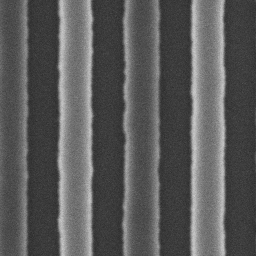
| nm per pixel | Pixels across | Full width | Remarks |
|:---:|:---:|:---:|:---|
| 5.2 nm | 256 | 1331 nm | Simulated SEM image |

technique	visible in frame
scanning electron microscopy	lines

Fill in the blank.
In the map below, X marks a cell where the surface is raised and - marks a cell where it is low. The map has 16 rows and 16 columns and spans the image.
XX--XX--XX--XX--
XX--XX--XX--XX--
XX--XX--XX--XX--
XX--XX--XX--XX--
XX--XX--XX--XX--
XX--XX--XX--XX--
XX--XX--XX--XX--
XX--XX--XX--XX--
XX--XX--XX--XX--
XX--XX--XX--XX--
XX--XX--XX--XX--
XX--XX--XX--XX--
XX--XX--XX--XX--
XX--XX--XX--XX--
XX--XX--XX--XX--
XX--XX--XX--XX--